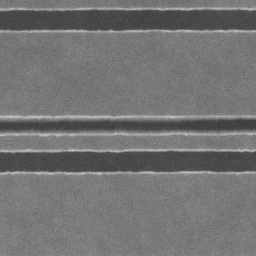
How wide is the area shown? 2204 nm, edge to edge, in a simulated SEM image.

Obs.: lines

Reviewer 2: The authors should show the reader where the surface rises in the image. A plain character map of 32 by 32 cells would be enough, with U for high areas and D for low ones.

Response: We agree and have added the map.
UUUUUUUUUUUUUUUUUUUUUUUUUUUUUUUU
DDDDDDDDDDDDDDDDDDDDDDDDDDDDDDDD
DDDDDDDDDDDDDDDDDDDDDDDDDDDDDDDD
DDDDDDDDDDDDDDDDDDDDDDDDDDDDDDDD
UUUUUUUUUUUUUUUUUUUUUUUUUUUUUUUU
UUUUUUUUUUUUUUUUUUUUUUUUUUUUUUUU
UUUUUUUUUUUUUUUUUUUUUUUUUUUUUUUU
UUUUUUUUUUUUUUUUUUUUUUUUUUUUUUUU
UUUUUUUUUUUUUUUUUUUUUUUUUUUUUUUU
UUUUUUUUUUUUUUUUUUUUUUUUUUUUUUUU
UUUUUUUUUUUUUUUUUUUUUUUUUUUUUUUU
UUUUUUUUUUUUUUUUUUUUUUUUUUUUUUUU
UUUUUUUUUUUUUUUUUUUUUUUUUUUUUUUU
UUUUUUUUUUUUUUUUUUUUUUUUUUUUUUUU
UUUUUUUUUUUUUUUUUUUUUUUUUUUUUUUU
DDDDDDDDDDDDDDDDDDDDDDDDDDDDDDDD
DDDDDDDDDDDDDDDDDDDDDDDDDDDDDDDD
UUUUUUUUUUUUUUUUUUUUUUUUUUUUUUUU
UUUUUUUUUUUUUUUUUUUUUUUUUUUUUUUU
DDDDDDDDDDDDDDDDDDDDDDDDDDDDDDDD
DDDDDDDDDDDDDDDDDDDDDDDDDDDDDDDD
DDDDDDDDDDDDDDDDDDUDDDUUUUUDDDUU
UUUUUUUUUUUUUUUUUUUUUUUUUUUUUUUU
UUUUUUUUUUUUUUUUUUUUUUUUUUUUUUUU
UUUUUUUUUUUUUUUUUUUUUUUUUUUUUUUU
UUUUUUUUUUUUUUUUUUUUUUUUUUUUUUUU
UUUUUUUUUUUUUUUUUUUUUUUUUUUUUUUU
UUUUUUUUUUUUUUUUUUUUUUUUUUUUUUUU
UUUUUUUUUUUUUUUUUUUUUUUUUUUUUUUU
UUUUUUUUUUUUUUUUUUUUUUUUUUUUUUUU
UUUUUUUUUUUUUUUUUUUUUUUUUUUUUUUU
UUUUUUUUUUUUUUUUUUUUUUUUUUUUUUUU